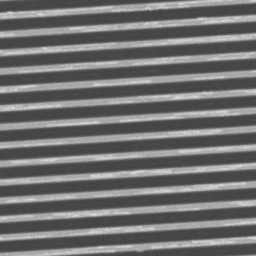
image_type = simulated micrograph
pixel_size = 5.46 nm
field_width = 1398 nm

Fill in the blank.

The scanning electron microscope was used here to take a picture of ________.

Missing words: parallel lines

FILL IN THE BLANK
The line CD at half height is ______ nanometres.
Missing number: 47.7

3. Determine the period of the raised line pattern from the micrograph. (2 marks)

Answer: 101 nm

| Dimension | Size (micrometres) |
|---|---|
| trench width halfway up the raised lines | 0.0532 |